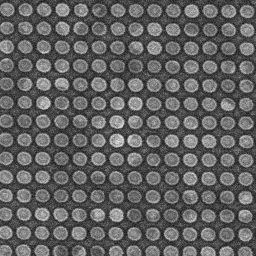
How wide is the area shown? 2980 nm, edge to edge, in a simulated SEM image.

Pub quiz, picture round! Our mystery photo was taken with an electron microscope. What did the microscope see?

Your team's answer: a regular array of raised bodies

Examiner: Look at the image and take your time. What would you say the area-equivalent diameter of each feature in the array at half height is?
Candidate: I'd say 147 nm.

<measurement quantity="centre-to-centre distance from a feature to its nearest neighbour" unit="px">18.3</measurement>